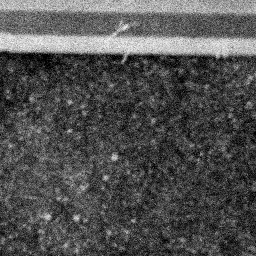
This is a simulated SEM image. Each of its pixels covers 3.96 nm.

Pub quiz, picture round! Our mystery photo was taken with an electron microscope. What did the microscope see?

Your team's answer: one or a few lines or trenches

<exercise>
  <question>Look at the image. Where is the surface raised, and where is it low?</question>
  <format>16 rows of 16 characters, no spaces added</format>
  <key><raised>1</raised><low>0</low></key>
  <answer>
1111111111111111
1111111111111111
1111111111111111
0000000000000000
0000000000000000
0000000000000000
0000000000000000
0000000000000000
0000000000000000
0000000000000000
0000000000000000
0000000000000000
0000000000000000
0000000000000000
0000000000000000
0000000000000000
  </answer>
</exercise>